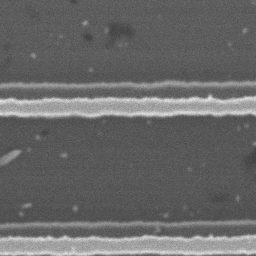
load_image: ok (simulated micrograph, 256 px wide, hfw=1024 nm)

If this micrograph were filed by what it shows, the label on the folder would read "lines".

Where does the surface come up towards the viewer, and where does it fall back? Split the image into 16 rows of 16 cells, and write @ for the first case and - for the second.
----------------
----------------
----------------
----------------
----------------
@@@@@@@@@@@@@@@@
@@@@@@@@@@@@@@@@
----------------
----------------
----------------
----------------
----------------
----------------
----------------
@@@@@@@@@@@@@@@@
@@@@@@@@@@@@@@@@